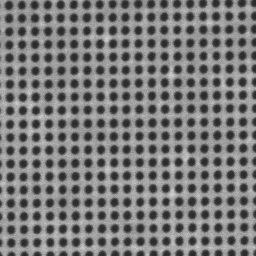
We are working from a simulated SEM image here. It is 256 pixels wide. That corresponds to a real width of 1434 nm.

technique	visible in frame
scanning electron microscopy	a regular array of holes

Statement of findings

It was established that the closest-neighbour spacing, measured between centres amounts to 71.3 nanometres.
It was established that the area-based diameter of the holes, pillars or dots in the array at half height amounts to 48.9 nm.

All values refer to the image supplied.